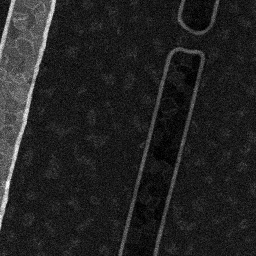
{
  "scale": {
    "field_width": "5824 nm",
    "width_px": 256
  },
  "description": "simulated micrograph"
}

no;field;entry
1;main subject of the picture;one or a few lines or trenches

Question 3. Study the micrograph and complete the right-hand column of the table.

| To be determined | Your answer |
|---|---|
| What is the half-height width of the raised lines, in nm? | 778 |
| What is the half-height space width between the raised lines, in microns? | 2.85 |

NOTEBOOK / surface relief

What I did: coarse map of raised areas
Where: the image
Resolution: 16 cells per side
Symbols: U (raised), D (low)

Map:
DUUDDDDDDDDUUDDD
UUUDDDDDDDDUUDDD
UUUDDDDDDDDDDDDD
UUUDDDDDDDDUDDDD
UUDDDDDDDDUUUDDD
UUDDDDDDDDUUDDDD
UUDDDDDDDDUUDDDD
UUDDDDDDDDUUDDDD
UDDDDDDDDUUUDDDD
UDDDDDDDDUUDDDDD
UDDDDDDDDUUDDDDD
DDDDDDDDDUUDDDDD
DDDDDDDDUUUDDDDD
DDDDDDDDUUDDDDDD
DDDDDDDDUUDDDDDD
DDDDDDDDUUDDDDDD